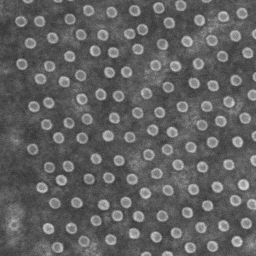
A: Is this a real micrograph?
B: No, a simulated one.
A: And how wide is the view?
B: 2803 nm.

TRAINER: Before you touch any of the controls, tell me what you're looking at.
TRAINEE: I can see a regular array of raised bodies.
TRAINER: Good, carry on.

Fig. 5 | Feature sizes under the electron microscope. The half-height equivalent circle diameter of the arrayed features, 9.97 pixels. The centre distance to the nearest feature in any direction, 0.211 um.